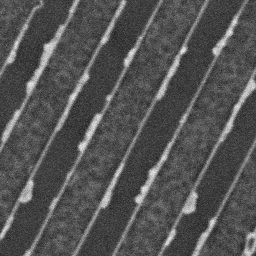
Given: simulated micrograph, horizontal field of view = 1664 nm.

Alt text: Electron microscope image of one or a few lines or trenches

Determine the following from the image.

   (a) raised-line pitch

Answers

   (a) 486 nm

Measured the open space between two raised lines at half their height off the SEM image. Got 257 nanometers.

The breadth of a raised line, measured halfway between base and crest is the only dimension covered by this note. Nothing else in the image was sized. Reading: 227 nm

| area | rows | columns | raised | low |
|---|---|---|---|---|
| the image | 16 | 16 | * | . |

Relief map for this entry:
..***..***...**.
..**...**...***.
.***..***...**..
.**...**...***..
***..***...**...
**...**...***..*
**..***...**...*
*...**...***..**
...***...**...**
...**...***..***
..***..***...**.
..**...**...***.
.***..***...**..
.**...**...***..
***..***...**...
**...**...***..*